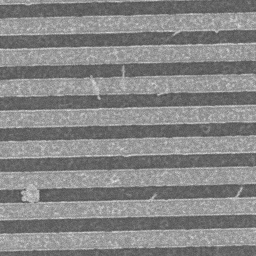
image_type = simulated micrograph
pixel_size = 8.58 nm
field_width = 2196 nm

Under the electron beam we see parallel lines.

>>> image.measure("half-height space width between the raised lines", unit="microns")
0.123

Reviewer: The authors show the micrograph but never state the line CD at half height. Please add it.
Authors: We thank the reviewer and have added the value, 16 pixels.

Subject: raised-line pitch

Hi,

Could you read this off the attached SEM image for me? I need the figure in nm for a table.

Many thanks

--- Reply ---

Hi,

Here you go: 264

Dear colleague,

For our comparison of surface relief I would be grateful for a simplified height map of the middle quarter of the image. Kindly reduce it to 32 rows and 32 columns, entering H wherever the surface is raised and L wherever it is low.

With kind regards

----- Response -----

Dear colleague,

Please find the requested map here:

LLLLLLLLLLLLLLLLLLLLLLLLLLLLLLLL
LLLLLLLLLLLLLLLLLLLLLLLLLLLLLLLL
LLLLLLLLLLLLLLLLLLLLLLLLLLLLLLLL
LLLLLLHLLLLLLLHHHHHHHHHHHHHHHHHH
HHHHHHHHHHHHHHHHHHHHHHHHHHHHHHHH
HHHHHHHHHHHHHHHHHHHHHHHHHHHHHHHH
HHHHHHHHHHHHHHHHHHHHHHHHHHHHHHHH
HHHHHLHLHLLLLLLLLLLLLLLLLLLLLLLL
LLLLLLLLLLLLLLLLLLLLLLLLLLLLLLLL
LLLLLLLLLLLLLLLLLLLLLLLLLLLLLLLL
LLLLLLLLLLLLLLLLLLLLLLLLLLLLLLLL
LLLLLLHHHHHHHHHHHHHHHHHHHHHHHHHH
HHHHHHHHHHHHHHHHHHHHHHHHHHHHHHHH
HHHHHHHHHHHHHHHHHHHHHHHHHHHHHHHH
HHHHHHHHHHHHHHHHHHHHHHHHHHHHHHHH
LLLLLLLLLLLLLLLLLLLLLLLLLLLLLLLL
LLLLLLLLLLLLLLLLLLLLLLLLLLLLLLLL
LLLLLLLLLLLLLLLLLLLLLLLLLLLLLLLL
LLLLLLLLLLLLLLLLLLLLLLLLLLLLLLLH
HHHHHHHHHHHHHHHHHHHHHHHHHHHHHHHH
HHHHHHHHHHHHHHHHHHHHHHHHHHHHHHHH
HHHHHHHHHHHHHHHHHHHHHHHHHHHHHHHH
HHHHHHHHHHHHHHHHHHHHHLLLLLLLLLLL
LLLLLLLLLLLLLLLLLLLLLLLLLLLLLLLL
LLLLLLLLLLLLLLLLLLLLLLLLLLLLLLLL
LLLLLLLLLLLLLLLLLLLLLLLLLLLLLLLL
LLLLLLLLLLLLLLLLLLLLLHHHHHHHHHHH
HHHHHHHHHHHHHHHHHHHHHHHHHHHHHHHH
HHHHHHHHHHHHHHHHHHHHHHHHHHHHHHHH
HHHHHHHHHHHHHHHHHHHHHHHHHHHHHHHH
HHHHHHHHHHHHHLLHHLHHHLLLLLLLLLLL
LLLLLLLLLLLLLLLLLLLLLLLLLLLLLLLL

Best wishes